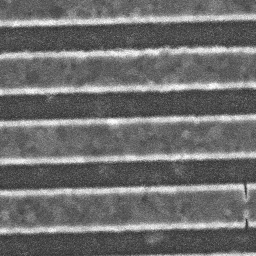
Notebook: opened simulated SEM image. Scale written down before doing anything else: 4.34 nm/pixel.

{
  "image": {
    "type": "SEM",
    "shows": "one or a few lines or trenches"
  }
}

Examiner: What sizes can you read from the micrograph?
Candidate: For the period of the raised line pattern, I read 0.3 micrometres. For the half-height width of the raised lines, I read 162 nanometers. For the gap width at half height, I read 138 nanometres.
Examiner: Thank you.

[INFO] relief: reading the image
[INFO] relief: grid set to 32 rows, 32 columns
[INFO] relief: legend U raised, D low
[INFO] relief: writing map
UUUUUUUUUUUUUUUUUUUUUUUUUUUUUUUU
UUUUUUUUUUUUUUUUUUUUUUUUUUUUUUUU
UUUUUUUUUUUUUUUUDDDDDDDDDDDDDDDD
DDDDDDDDDDDDDDDDDDDDDDDDDDDDDDDD
DDDDDDDDDDDDDDDDDDDDDDDDDDDDDDDD
DDDDDDDDDDDDDDDDDDDDDDDDDDDDDDDD
DDDDDDDDDDDDDDDDDDUUUUUUUUUUUUUU
UUUUUUUUUUUUUUUUUUUUUUUUUUUUUUUU
UUUUUUUUUUUUUUUUUUUUUUUUUUUUUUUU
UUUUUUUUUUUUUUUUUUUUUUUUUUUUUUUU
UUUUUUUUUUUUUUUUUUUUUUUUUUUUUUUU
DDDDDDDDDDDDDDDDDDDDDDDDDDDDDDDD
DDDDDDDDDDDDDDDDDDDDDDDDDDDDDDDD
DDDDDDDDDDDDDDDDDDDDDDDDDDDDDDDD
DDDDDDDDDDDDDDDDDDDDDDDDDDDDDDDD
DUUUUUUUUUUUUUUUUUUUUUUUUUUUUUUU
UUUUUUUUUUUUUUUUUUUUUUUUUUUUUUUU
UUUUUUUUUUUUUUUUUUUUUUUUUUUUUUUU
UUUUUUUUUUUUUUUUUUUUUUUUUUUUUUUU
UUUUUUUUUUUUUUUUUUUUUUUUUUDDDDDD
DDDDDDDDDDDDDDDDDDDDDDDDDDDDDDDD
DDDDDDDDDDDDDDDDDDDDDDDDDDDDDDDD
DDDDDDDDDDDDDDDDDDDDDDDDDDDDDDDD
DDDDDDDDDDDDDDDDDDDDDDDDDDDDDUDU
UUUUUUUUUUUUUUUUUUUUUUUUUUUUUUUU
UUUUUUUUUUUUUUUUUUUUUUUUUUUUUUUU
UUUUUUUUUUUUUUUUUUUUUUUUUUUUUUUU
UUUUUUUUUUUUUUUUUUUUUUUUUUUUUUUU
UUUUUUUUUUUUDDUUDDDDDDDDDDDDDDDD
DDDDDDDDDDDDDDDDDDDDDDDDDDDDDDDD
DDDDDDDDDDDDDDDDDDDDDDDDDDDDDDDD
DDDDDDDDDDDDDDDDDDDDDDDDDDDDDDDD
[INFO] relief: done